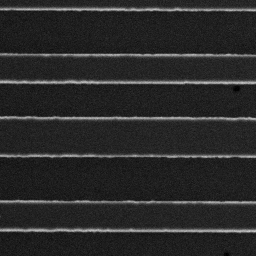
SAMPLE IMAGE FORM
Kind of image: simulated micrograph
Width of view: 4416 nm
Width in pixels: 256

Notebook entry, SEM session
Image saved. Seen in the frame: lines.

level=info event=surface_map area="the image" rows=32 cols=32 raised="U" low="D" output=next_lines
UUUUUUUUUUUUUUUUUUUUUUUUUUUUUUUU
DDDDDDDDDDDDDDDDDDDDDDDDDDDDDDDD
DDDDDDDDDDDDDDDDDDDDDDDDDDDDDDDD
DDDDDDDDDDDDDDDDDDDDDDDDDDDDDDDD
DDDDDDDDDDDDDDDDDDDDDDDDDDDDDDDD
DDDDDDDDDDDDDDDDDDDDDDDDDDDDDDDD
DDDDDDDDDDDDDDDDDDDDDDDDDDDDDDDD
UUUUUUUUUUUUUUUUUUUUUUUUUUUUUUUU
UUUUUUUUUUUUUUUUUUUUUUUUUUUUUUUU
UUUUUUUUUUUUUUUUUUUUUUUUUUUUUUUU
DDDDDDDDDDDDDDDDDDDDDDDDDDDDDDDD
DDDDDDDDDDDDDDDDDDDDDDDDDDDDDDDD
DDDDDDDDDDDDDDDDDDDDDDDDDDDDDDDD
DDDDDDDDDDDDDDDDDDDDDDDDDDDDDDDD
DDDDDDDDDDDDDDDDDDDDDDDDDDDDDDDD
UUUUUUUUUUUUUUUUUUUUUUUUUUUUUUUU
UUUUUUUUUUUUUUUUUUUUUUUUUUUUUUUU
UUUUUUUUUUUUUUUUUUUUUUUUUUUUUUUU
UUUUUUUUUUUUUUUUUUUUUUUUUUUUUUUU
UUUUUUUUUUUUUUUUUUUUUUUUUUUUUUUU
DDDDDDDDDDDDDDDDDDDDDDDDDDDDDDDD
DDDDDDDDDDDDDDDDDDDDDDDDDDDDDDDD
DDDDDDDDDDDDDDDDDDDDDDDDDDDDDDDD
DDDDDDDDDDDDDDDDDDDDDDDDDDDDDDDD
DDDDDDDDDDDDDDDDDDDDDDDDDDDDDDDD
UUUUUUUUUUUUUUUUUUUUUUUUUUUUUUUU
UUUUUUUUUUUUUUUUUUUUUUUUUUUUUUUU
UUUUUUUUUUUUUUUUUUUUUUUUUUUUUUUU
UUUUUUUUUUUUUUUUUUUUUUUUUUUUUUUU
DDDDDDDDDDDDDDDDDDDDDDDDDDDDDDDD
DDDDDDDDDDDDDDDDDDDDDDDDDDDDDDDD
DDDDDDDDDDDDDDDDDDDDDDDDDDDDDDDD